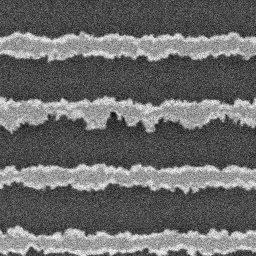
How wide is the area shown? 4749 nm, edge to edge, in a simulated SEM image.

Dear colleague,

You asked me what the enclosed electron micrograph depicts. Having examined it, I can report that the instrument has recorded one or a few lines or trenches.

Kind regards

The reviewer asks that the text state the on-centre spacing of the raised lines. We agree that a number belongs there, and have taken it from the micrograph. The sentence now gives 1.21 µm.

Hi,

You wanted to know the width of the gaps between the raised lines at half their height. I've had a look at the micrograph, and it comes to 886 nanometers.